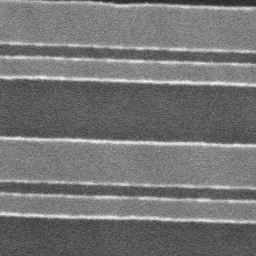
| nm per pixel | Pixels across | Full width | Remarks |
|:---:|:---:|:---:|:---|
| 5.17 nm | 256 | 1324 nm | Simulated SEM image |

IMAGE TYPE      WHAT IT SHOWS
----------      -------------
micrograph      lines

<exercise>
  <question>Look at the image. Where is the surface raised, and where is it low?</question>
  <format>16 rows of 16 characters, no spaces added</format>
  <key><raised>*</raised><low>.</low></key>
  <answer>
**************..
****************
****************
****************
****************
................
................
................
................
****************
****************
****************
****************
...*************
................
................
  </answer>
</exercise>